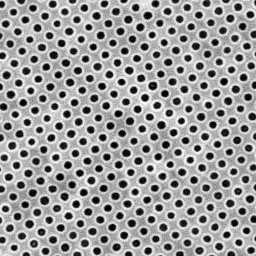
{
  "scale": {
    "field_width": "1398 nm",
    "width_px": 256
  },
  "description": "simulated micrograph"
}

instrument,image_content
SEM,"a regular array of holes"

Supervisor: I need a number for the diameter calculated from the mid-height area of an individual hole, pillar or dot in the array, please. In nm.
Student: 45.7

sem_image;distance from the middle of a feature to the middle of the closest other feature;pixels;13.9